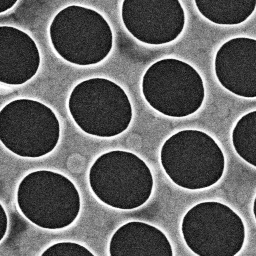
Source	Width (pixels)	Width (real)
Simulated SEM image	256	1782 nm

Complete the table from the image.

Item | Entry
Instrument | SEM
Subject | holes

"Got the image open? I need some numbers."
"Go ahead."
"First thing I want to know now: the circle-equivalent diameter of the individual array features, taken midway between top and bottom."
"426 nm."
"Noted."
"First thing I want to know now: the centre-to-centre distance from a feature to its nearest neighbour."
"0.518 µm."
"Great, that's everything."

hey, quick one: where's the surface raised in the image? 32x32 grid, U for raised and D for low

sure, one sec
DDUUUUUUUUUUUUUDDDDDDDDUDDDDDDDD
UUUUUUUDDDDDUUUDDDDDDDDUUDDDDDDD
UUUUUUUDDDDDDUUDDDDDDDDUUUDDDDDU
DDUUUUDDDDDDDDUUDDDDDDDUUUUUUUUU
DDDDUUDDDDDDDDUUUDDDDDUUUUUUUUUU
DDDDUUDDDDDDDDUUUUUDUUUUUUUUDDDD
DDDDDUUDDDDDDDUUUUUUUUUUUUUDDDDD
DDDDDUUUDDDDDUUUUUUUDDUUUUUDDDDD
DDDDDUUUUUUUUUUUUUUDDDDDUUUDDDDD
DDDDUUUUUUUUUUUUUUDDDDDDDUUDDDDD
UDDUUUUUUUDDDDDUUUDDDDDDDUUUDDDD
UUUUUUUUUDDDDDDDUUDDDDDDDDUUUDDD
UUDDUUUUUDDDDDDDUUDDDDDDDUUUUUUU
DDDDDDUUUDDDDDDDUUUDDDDDDUUUUUUU
DDDDDDDUUDDDDDDDUUUUUDDUUUUUUUDD
DDDDDDDUUUDDDDDDUUUUUUUUUUUUUUDD
DDDDDDDUUUUDDDDUUUUUUUDDDUUUUDDD
DDDDDDDUUUUUUUUUUUUUUDDDDDDUUDDD
UDDDDDDUUUUUUUUUUUUUDDDDDDDUUDDD
UUUDDUUUUUUUUDDDDUUUDDDDDDDDUUDD
UUUUUUUUUUUUDDDDDDUUDDDDDDDDUUUD
UUUUDDDUUUUDDDDDDDDUUDDDDDDDUUUU
UUUDDDDDDUUDDDDDDDDUUDDDDDDUUUUU
UUDDDDDDDDUDDDDDDDDUUUUDDUUUUUUU
UUDDDDDDDDUUDDDDDDDUUUUUUUUUUUUU
UUDDDDDDDDUUUDDDDDUUUUUUUDDDUUUU
DUUDDDDDDDUUUUUUUUUUUUUDDDDDDUUU
DUUUDDDDDUUUUUUUUUUUUUUDDDDDDDUU
DUUUUDDDUUUUUUUDDDDDUUUDDDDDDDDU
DUUUUUUUUUUUUUDDDDDDDUUDDDDDDDDU
UUUUUUUDDDUUUUDDDDDDDUUDDDDDDDUU
UUUUUDDDDDDUUUDDDDDDDDUUDDDDDDUU